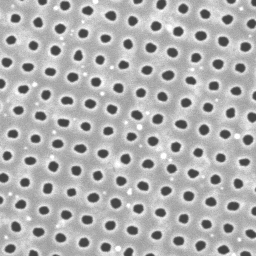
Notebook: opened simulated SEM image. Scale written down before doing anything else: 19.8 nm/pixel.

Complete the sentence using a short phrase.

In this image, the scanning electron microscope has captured a regular array of holes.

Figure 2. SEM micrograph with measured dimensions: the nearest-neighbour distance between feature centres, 440 nanometres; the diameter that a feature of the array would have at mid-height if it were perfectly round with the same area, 0.211 um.